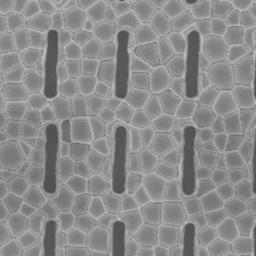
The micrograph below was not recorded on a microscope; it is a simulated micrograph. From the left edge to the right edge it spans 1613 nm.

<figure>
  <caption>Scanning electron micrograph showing holes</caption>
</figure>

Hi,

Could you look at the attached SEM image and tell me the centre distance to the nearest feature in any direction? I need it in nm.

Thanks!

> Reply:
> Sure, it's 440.